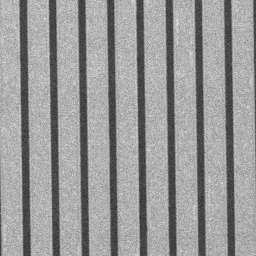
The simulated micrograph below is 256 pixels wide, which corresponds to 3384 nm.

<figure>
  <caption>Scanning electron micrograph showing parallel lines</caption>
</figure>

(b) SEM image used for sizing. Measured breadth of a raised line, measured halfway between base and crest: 276 nanometers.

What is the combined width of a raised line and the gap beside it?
386 nm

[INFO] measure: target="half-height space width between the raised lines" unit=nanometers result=112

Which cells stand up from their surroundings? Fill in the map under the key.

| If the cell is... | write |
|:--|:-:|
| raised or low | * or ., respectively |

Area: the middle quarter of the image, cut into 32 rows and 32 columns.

****..*****..*****..*****...****
****..*****..*****..*****...****
****..*****..*****..*****...****
****..*****..*****..*****...****
****..*****..*****..*****...****
****..*****..*****..*****...****
****..*****..*****..*****...****
****..*****..*****..*****...****
****..*****..*****..*****...****
****..*****..*****..*****...****
****..*****..*****..*****...****
****..*****..*****...****...****
****..*****..*****...****...****
****..*****..*****...*****..****
****..*****..*****...*****..****
****..*****..*****...*****..****
****..*****..*****...*****..****
****..*****..*****...*****..****
****..*****..*****...*****..****
****..*****...****...*****..****
****..*****..*****...*****..****
****..*****..*****...*****..****
****..*****..*****...*****..****
****..*****..*****...*****..****
****..*****..*****...*****..****
****..*****...****...*****..****
****..*****...****...*****..****
****..*****..*****...*****..****
****..*****..*****...*****..****
****..*****..*****...*****..****
****..*****...****...*****..****
****..*****...****...*****..****